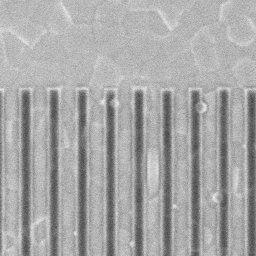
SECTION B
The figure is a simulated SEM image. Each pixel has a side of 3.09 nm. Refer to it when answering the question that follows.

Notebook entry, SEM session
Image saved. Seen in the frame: parallel lines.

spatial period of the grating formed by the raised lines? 28.3 px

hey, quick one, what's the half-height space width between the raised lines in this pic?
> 47.4 nm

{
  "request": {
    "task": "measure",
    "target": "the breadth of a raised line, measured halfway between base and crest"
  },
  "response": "40.5 nanometres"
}